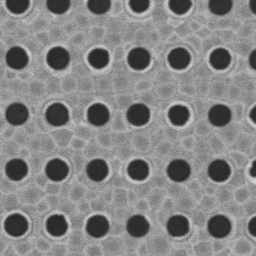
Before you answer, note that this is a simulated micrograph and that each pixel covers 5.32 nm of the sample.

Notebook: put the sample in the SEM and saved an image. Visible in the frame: a regular array of holes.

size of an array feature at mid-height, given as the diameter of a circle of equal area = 22.9 px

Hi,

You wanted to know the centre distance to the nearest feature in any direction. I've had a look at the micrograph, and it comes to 215 nanometers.